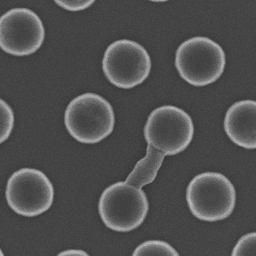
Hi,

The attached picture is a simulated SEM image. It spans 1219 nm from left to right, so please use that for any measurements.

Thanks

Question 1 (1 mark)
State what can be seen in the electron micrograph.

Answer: raised bodies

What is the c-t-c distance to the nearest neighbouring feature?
352 nm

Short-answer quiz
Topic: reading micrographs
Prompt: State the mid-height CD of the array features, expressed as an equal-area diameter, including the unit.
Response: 220 nanometres